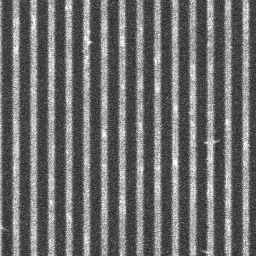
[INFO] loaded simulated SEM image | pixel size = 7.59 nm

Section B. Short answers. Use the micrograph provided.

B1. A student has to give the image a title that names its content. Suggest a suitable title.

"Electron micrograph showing parallel lines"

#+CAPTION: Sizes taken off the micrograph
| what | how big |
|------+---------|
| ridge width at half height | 45.6 nanometres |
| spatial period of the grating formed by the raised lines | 134 nm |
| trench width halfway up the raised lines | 83.5 nm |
